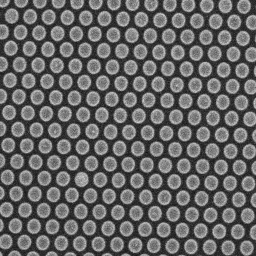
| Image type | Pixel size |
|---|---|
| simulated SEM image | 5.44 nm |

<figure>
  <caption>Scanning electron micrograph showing a regular array of raised bodies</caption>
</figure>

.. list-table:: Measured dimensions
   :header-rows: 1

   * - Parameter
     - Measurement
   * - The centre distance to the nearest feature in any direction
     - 0.0995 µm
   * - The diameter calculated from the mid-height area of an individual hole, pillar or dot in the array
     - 0.0761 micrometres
